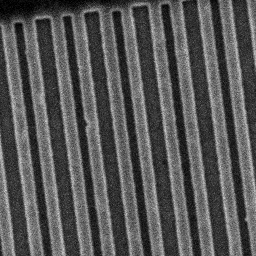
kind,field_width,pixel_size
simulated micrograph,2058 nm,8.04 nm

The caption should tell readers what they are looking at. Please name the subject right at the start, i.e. parallel lines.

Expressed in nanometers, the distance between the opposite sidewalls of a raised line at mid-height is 94.7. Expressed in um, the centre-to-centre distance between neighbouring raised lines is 0.196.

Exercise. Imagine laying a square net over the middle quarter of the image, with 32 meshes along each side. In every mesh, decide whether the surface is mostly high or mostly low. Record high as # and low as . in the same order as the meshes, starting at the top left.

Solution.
#...##.....##...###....###...##.
#...###....###..###....###...##.
#...###....###..###....###...###
##..###....###...##.....##...###
##..###....###...##.....###..###
##..###....###...##.....###..###
##..###....###...##.....###..###
##...##.....##...###....###..###
##...###....###..###....###..###
##...###....###..###....###...##
##...###....###..###....###...##
###..###....###...##.....##...##
###..###....###...##.....##...##
###..###....###...##.....###..##
###...##....###...###....###..##
###...##.....##...###....###..##
###...##.....###..###....###...#
.##...###....###..###....###...#
.##...###....###..###.....##...#
.###..###....###...##.....##...#
.###..###....###...##.....###..#
.###..###....###...##.....##...#
.###..###.....##...###....###..#
.###...##.....##...###....###...
.###...###....###..###....###...
..##...###....###..###....###...
..###..###....###..###.....##...
..###..###....###...##.....###..
..###..###....###...##.....###..
..###...##....###...##.....###..
..###...##.....###..###....###..
..###...##.....##...###....###..